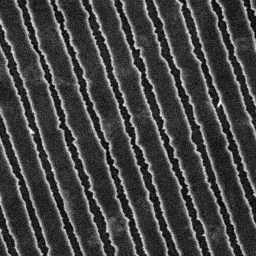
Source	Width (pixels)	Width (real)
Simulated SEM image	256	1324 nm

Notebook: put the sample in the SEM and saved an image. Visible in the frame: parallel lines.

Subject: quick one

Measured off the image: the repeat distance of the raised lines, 156 nanometres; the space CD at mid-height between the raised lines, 0.0385 um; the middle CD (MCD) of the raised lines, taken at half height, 120 nm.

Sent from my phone